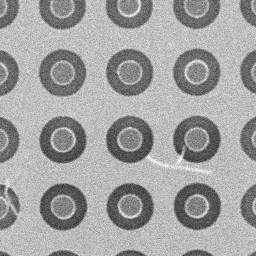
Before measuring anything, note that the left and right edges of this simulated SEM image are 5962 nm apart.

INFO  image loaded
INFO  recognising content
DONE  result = an array of small figures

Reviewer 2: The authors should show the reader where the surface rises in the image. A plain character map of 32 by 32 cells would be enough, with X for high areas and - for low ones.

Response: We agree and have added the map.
--XXX------XX------XXX------XX--
--XXX------XX------XXX-----XXX--
--XXX-----XXXX-----XXX-----XXXX-
-XXXXXX--XXXXXX--XXXXXXX-XXXXXXX
XXXXXXXXXXXXXXXXXXXXXXXXXXXXXXXX
XXXXXXXXXXXXXXXXXXXXXXXXXXXXXXXX
-XXXXX---XXXXXX---XXXXX---XXXXX-
--XXX-----XXXX-----XXX-----XXX--
--XXX------XX------XXX------XX--
--XXX------XX------XXX------XX--
--XXX-----XXXX-----XXX-----XXX--
-XXXXX----XXXXX---XXXXX---XXXXX-
XXXXXXXXXXXXXXXXXXXXXXXXXXXXXXXX
XXXXXXXXXXXXXXXXXXXXXXXXXXXXXXXX
XXXXXXXXXXXXXXXXXXXXXXXX-XXXXXXX
--XXXX----XXXX-----XXX-----XXXX-
--XXX------XX------XXX-----XXX--
--XXX------XX------XXX------XX--
--XXX------XX------XXX-----XXX--
--XXXX----XXXX----XXXXX----XXXX-
XXXXXXXXXXXXXXXXXXXXXXXXXXXXXXXX
XXXXXXXXXXXXXXXXXXXXXXXXXXXXXXXX
XXXXXXXXXXXXXXXXXXXXXXXXXXXXXXXX
-XXXXX----XXXX----XXXXX----XXXX-
--XXX------XXX-----XXX-----XXX--
--XXX------XX------XXX------XX--
--XXX------XX------XXX------XX--
--XXX-----XXXX-----XXX-----XXXX-
-XXXXXX--XXXXXX---XXXXX---XXXXXX
XXXXXXXXXXXXXXXXXXXXXXXXXXXXXXXX
XXXXXXXXXXXXXXXXXXXXXXXXXXXXXXXX
XXXXXXX--XXXXXX---XXXXX---XXXXXX